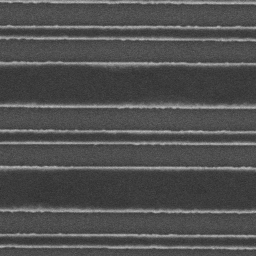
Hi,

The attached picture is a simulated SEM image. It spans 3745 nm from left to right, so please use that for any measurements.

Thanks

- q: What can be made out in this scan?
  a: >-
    lines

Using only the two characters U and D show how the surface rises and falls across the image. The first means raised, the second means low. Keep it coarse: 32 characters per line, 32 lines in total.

DDDDDDDDDDDDDDDDDDDDDDDDDDDDDDDD
DDDDDDDDDDDDDDDDDDDDDDDDDDDDDDDD
DDDDDDDDDDDDDDDDDDDDDDDDDDDDDDDD
UUUUUUUUUUUUUUUUUUUUUUUUUUUUUUUU
UUUUUUUUUUUUUUUUUUUUUUUUUUUUUUUU
DDDDDDDDDDDDDDDDDDDDDDDDDDDDDDDD
DDDDDDDDDDDDDDDDDDDDDDDDDDDDDDDD
DDDDDDDDDDDDDDDDDDDDDDDDDDDDDDDD
UUUUUUUUUUUUUUUUUUUUUUUUUUUUUUUU
UUUUUUUUUUUUUUUUUUUUUUUUUUUUUUUU
UUUUUUUUUUUUUUUUUUUUUUUUUUUUUUUU
UUUUUUUUUUUUUUUUUUUUUUUUUUUUUUUU
UUUUUUUUUUUUUUUUUUUUUUUUUUUUUUUU
DDDDDDDDDDDDDDDDDDDDDDDDDDDDDDDD
DDDDDDDDDDDDDDDDDDDDDDDDDDDDDDDD
DDDDDDDDDDDDDDDDDDDDDDDDDDDDDDDD
UUUUUUUUUUUUUUUUUUUUUUUUUUUUUUUU
UUUUUUUUUUUUUUUUUUUUUUUUUUUUUUUU
DDDDDDDDDDDDDDDDDDDDDDDDDDDDDDDD
DDDDDDDDDDDDDDDDDDDDDDDDDDDDDDDD
DDDDDDDDDDDDDDDDDDDDDDDDDDDDDDDD
UUUUUUUUUUUUUUUUUUUUUUUUUUUUUUUU
UUUUUUUUUUUUUUUUUUUUUUUUUUUUUUUU
UUUUUUUUUUUUUUUUUUUUUUUUUUUUUUUU
UUUUUUUUUUUUUUUUUUUUUUUUUUUUUUUU
UUUUUUUUUUUUUUUUUUUUUUUUUUUUUUUU
DDDDDDDDDDDDDDDDDDDDDDUDUUUUUUUU
DDDDDDDDDDDDDDDDDDDDDDDDDDDDDDDD
DDDDDDDDDDDDDDDDDDDDDDDDDDDDDDDD
UUUUUUUUUUUUUUUUUUUUUUUUUUUUUUUU
UUUUUUUUUUUUUUUUUUUUUUUUUUUUUUUU
DDDDDDDDDDDDDDDDDDDDDDDDDDDDDDDD